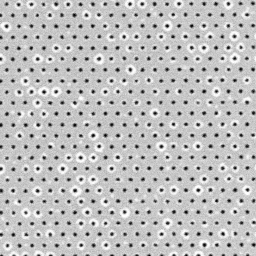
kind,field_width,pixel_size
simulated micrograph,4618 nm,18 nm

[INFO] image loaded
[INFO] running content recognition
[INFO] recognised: a regular array of holes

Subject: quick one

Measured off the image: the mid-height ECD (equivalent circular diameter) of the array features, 4.22 pixels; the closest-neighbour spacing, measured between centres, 218 nm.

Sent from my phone